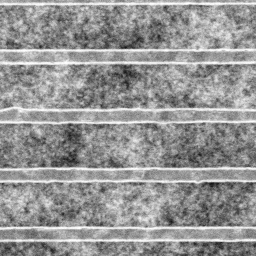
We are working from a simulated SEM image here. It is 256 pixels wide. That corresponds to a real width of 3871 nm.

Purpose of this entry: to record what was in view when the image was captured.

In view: parallel lines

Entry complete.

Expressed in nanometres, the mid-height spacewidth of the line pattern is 700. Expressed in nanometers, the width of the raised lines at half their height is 191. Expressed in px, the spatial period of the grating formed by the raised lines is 59.3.